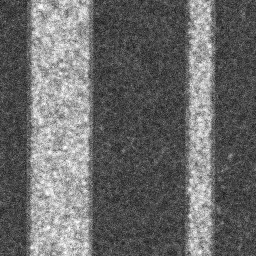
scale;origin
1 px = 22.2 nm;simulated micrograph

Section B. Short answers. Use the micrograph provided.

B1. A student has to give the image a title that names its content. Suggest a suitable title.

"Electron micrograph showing one or a few lines or trenches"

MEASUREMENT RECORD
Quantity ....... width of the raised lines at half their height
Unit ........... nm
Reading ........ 2100